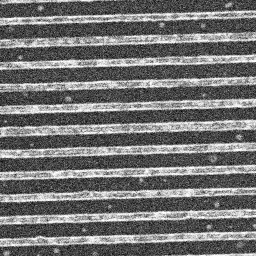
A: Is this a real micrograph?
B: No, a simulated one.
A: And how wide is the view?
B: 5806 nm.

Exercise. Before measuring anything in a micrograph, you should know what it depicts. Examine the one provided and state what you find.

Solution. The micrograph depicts parallel lines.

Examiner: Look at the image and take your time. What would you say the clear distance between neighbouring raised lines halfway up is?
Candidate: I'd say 346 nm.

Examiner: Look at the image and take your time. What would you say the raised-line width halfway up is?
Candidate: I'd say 0.153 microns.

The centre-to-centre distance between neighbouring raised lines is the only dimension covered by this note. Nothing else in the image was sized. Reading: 22.1 px